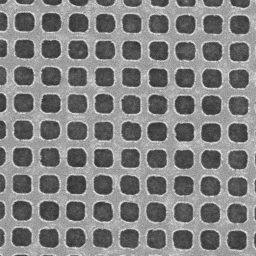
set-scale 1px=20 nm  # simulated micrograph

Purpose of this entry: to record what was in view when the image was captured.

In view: a regular array of holes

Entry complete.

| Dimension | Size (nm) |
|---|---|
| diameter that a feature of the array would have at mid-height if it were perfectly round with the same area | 418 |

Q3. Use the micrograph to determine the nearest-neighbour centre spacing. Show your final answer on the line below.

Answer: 534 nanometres